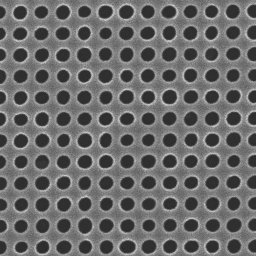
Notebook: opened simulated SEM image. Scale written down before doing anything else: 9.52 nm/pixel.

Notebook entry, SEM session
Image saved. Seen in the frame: a regular array of holes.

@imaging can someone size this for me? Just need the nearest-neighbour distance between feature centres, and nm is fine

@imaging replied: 198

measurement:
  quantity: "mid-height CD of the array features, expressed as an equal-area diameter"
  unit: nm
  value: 130